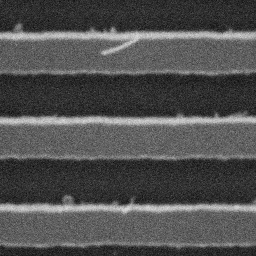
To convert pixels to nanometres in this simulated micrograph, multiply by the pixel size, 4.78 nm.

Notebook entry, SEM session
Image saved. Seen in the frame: lines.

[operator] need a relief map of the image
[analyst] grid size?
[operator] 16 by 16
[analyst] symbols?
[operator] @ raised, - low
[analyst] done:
----------------
----------------
@@@@@@@@@@@@@@@@
@@@@@@@@@@@@@@@@
@@@@@@@@@@@@@@@@
----------------
----------------
@@@@@@@@@@@@@@@@
@@@@@@@@@@@@@@@@
@@@@@@@@@@@@@@@@
----------------
----------------
----------------
@@@@@@@@@@@@@@@@
@@@@@@@@@@@@@@@@
----------------